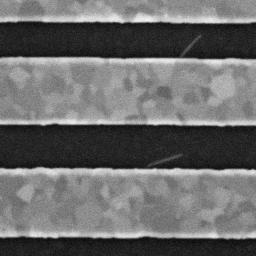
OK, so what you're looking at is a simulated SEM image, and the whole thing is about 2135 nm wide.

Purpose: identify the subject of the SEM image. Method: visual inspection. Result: lines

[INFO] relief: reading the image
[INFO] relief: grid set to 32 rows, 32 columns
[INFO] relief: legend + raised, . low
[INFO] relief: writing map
++++++++++++++++++++++++++++++++
++++++++++++++++++++++++++++++++
++++++++++++++++++++++++++++++++
................................
................................
................................
................................
+++++++++++++++++++++++++++++++.
++++++++++++++++++++++++++++++++
++++++++++++++++++++++++++++++++
++++++++++++++++++++++++++++++++
++++++++++++++++++++++++++++++++
++++++++++++++++++++++++++++++++
++++++++++++++++++++++++++++++++
++++++++++++++++++++++++++++++++
..........................++++.+
................................
................................
................................
................................
................................
++++++++++++++++++++++++++++++++
++++++++++++++++++++++++++++++++
++++++++++++++++++++++++++++++++
++++++++++++++++++++++++++++++++
++++++++++++++++++++++++++++++++
++++++++++++++++++++++++++++++++
++++++++++++++++++++++++++++++++
++++++++++++++++++++++++++++++++
+....+++...+++++++.+++++++++++++
................................
................................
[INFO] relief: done